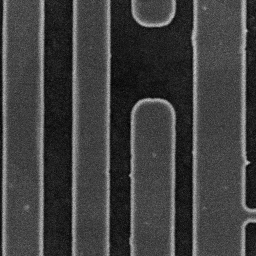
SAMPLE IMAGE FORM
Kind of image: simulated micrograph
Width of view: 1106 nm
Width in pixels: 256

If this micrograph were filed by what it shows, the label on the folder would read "one or a few lines or trenches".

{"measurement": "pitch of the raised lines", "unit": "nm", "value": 282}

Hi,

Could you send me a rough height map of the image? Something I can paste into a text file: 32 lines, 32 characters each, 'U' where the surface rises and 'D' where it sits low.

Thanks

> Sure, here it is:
DUUUUDDDDUUUUUDDDUUUUUDDUUUUUUUD
DUUUUDDDDUUUUUDDDUUUUUDDUUUUUUUD
DUUUUDDDDUUUUUDDDUUUUDDDUUUUUUUD
UUUUUDDDDUUUUUDDDDDDDDDDUUUUUUUD
UUUUUDDDDUUUUUDDDDDDDDDDUUUUUUUD
UUUUUDDDDUUUUUDDDDDDDDDDUUUUUUUD
UUUUUDDDDUUUUUDDDDDDDDDDUUUUUUUD
UUUUUDDDDUUUUUDDDDDDDDDDUUUUUUUD
UUUUUDDDDUUUUUDDDDDDDDDDUUUUUUUD
UUUUUDDDDUUUUUDDDDDDDDDDUUUUUUUD
DUUUUDDDDUUUUUDDDDDDDDDDUUUUUUUD
DUUUUDDDDUUUUUDDDDDDDDDDUUUUUUUD
DUUUUDDDDUUUUUDDDDUUDDDDUUUUUUUD
DUUUUDDDDUUUUUDDDUUUUUDDUUUUUUUD
DUUUUDDDDUUUUUDDDUUUUUDDUUUUUUUD
DUUUUDDDDUUUUUDDDUUUUUDDUUUUUUUD
DUUUUDDDDUUUUUDDDUUUUUDDUUUUUUUD
DUUUUDDDDUUUUUDDDUUUUUDDUUUUUUUD
DUUUUDDDDUUUUUDDDUUUUUDDUUUUUUUD
DUUUUDDDDUUUUUDDDUUUUUDDUUUUUUUD
DUUUUDDDDUUUUUDDDUUUUUDDUUUUUUUD
UUUUUDDDDUUUUUDDUUUUUUDDUUUUUUUD
UUUUUDDDDUUUUUDDUUUUUUDDUUUUUUUD
UUUUUDDDDUUUUUDDUUUUUUDDUUUUUUUD
UUUUUDDDDUUUUUDDUUUUUUDDUUUUUUUD
UUUUUDDDDUUUUUDDUUUUUUDDUUUUUUUD
UUUUUDDDDUUUUUDDUUUUUUDDUUUUUUUU
UUUUUDDDDUUUUUDDUUUUUUDDUUUUUUUU
UUUUUDDDDUUUUUDDUUUUUUDDUUUUUUUD
UUUUUDDDDUUUUUDDUUUUUUDDUUUUUUDD
UUUUUDDDDUUUUUDDUUUUUUDDUUUUUUDD
UUUUUDDDDUUUUUDDUUUUUUDDUUUUUUDD